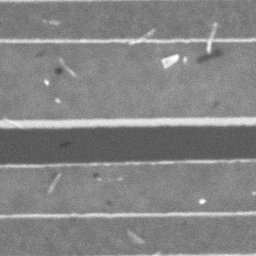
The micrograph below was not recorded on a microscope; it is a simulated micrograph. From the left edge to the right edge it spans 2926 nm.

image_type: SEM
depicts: lines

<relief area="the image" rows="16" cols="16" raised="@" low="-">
@@@@@@@@@@@@@@@@
@@@@@@@@@@@@@@@@
@@@@@@@@@@@@@@@@
----------------
----------------
----------------
----------------
----------------
@@@@@@@@@@@@@@@@
@@@@@@@@@@@@@@@@
----------------
----------------
----------------
----@@@@@@@@@@@@
@@@@@@@@@@@@@@@@
@@@@@@@@@@@@@@@@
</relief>